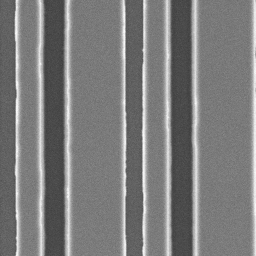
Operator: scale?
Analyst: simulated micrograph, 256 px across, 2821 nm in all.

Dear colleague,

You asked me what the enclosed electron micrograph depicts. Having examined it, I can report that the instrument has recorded lines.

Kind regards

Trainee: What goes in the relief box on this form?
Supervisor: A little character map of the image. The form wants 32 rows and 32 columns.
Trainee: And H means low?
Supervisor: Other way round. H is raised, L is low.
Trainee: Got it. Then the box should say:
HHHHHLLLHHHHHHHHHHHHHLLLHHHHHHHH
HHHHHLLLHHHHHHHHHHHHHLLLHHHHHHHH
HHHHHLLLHHHHHHHHHHHHHLLLHHHHHHHH
HHHHHLLLHHHHHHHHHHHHHLLLHHHHHHHH
HHHHHLLLHHHHHHHHHHHHHLLLHHHHHHHH
HHHHHLLLHHHHHHHHHHHHHLLLHHHHHHHH
HHHHHLLLHHHHHHHHHHHHHLLLHHHHHHHH
HHHHHLLLHHHHHHHHHHHHHLLLHHHHHHHH
HHHHHLLLHHHHHHHHHHHHHLLLHHHHHHHH
HHHHHLLLHHHHHHHHHHHHHLLLHHHHHHHH
HHHHHLLLHHHHHHHHHHHHHLLLHHHHHHHH
HHHHHLLLHHHHHHHHHHHHHLLLHHHHHHHH
HHHHHLLLHHHHHHHHHHHHHLLLHHHHHHHH
HHHHHLLLHHHHHHHHHHHHHLLLHHHHHHHH
HHHHHLLLHHHHHHHHHHHHHLLLHHHHHHHH
HHHHHLLLHHHHHHHHHHHHHLLLHHHHHHHH
HHHHHLLLHHHHHHHHHHHHHLLLHHHHHHHH
HHHHHLLLHHHHHHHHHHHHHLLLHHHHHHHH
HHHHHLLLHHHHHHHHHHHHHLLLHHHHHHHH
HHHHHLLLHHHHHHHHHHHHHLLLHHHHHHHH
HHHHHLLLHHHHHHHHHHHHHLLLHHHHHHHH
HHHHHLLLHHHHHHHHHHHHHLLLLHHHHHHH
HHHHHLLLHHHHHHHHHHHHHLLLLHHHHHHH
HHHHHLLLHHHHHHHHHHHHHLLLLHHHHHHH
HHHHHLLLHHHHHHHHHHHHHLLLHHHHHHHH
HHHHHLLLHHHHHHHHHHHHHLLLLHHHHHHH
HHHHHLLLHHHHHHHHHHHHHLLLLHHHHHHH
HHHHHLLLLHHHHHHHHHHHHLLLLHHHHHHH
HHHHHLLLHHHHHHHHHHHHHLLLLHHHHHHH
HHHHHLLLHHHHHHHHHHHHHLLLLHHHHHHH
HHHHHLLLHHHHHHHHHHHHHLLLLHHHHHHH
HHHHHLLLHHHHHHHHHHHHHLLLLHHHHHHH